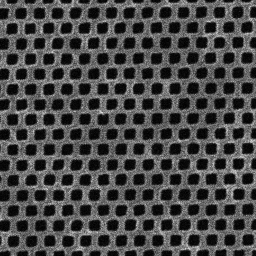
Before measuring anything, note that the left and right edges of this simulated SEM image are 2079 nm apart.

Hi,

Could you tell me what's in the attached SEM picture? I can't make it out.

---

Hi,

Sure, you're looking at a regular array of holes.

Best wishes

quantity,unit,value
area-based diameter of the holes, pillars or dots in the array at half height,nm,104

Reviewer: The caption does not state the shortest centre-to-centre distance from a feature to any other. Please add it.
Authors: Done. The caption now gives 140 nm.